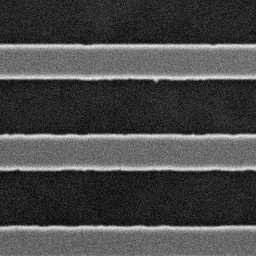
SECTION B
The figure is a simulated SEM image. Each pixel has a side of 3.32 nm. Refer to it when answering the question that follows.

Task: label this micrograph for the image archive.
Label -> lines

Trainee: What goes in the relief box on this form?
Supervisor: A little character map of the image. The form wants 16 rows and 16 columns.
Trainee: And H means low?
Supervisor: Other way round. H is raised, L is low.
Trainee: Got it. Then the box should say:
LLLLLLLLLLLLLLLL
LLLLLLLLLLLLLLLL
LLLLLLLLLLLLLLLL
HHHHHHHHHHHHHHHH
HHHHHHHHHHHHHHHH
LLLLLLLLLLLLLLLL
LLLLLLLLLLLLLLLL
LLLLLLLLLLLLLLLL
HHHHHHHHHHHHHHHH
HHHHHHHHHHHHHHHH
HHHHHHHHHHHHHHHH
LLLLLLLLLLLLLLLL
LLLLLLLLLLLLLLLL
LLLLLLLLLLLLLLLL
HHHHHHHHHHHHHHHH
HHHHHHHHHHHHHHHH